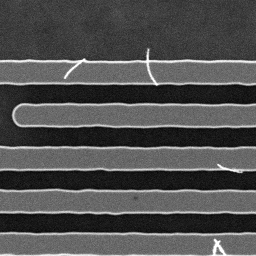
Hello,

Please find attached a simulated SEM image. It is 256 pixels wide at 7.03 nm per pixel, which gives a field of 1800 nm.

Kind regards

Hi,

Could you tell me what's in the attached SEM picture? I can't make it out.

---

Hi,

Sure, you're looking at groups of lines, slits or small figures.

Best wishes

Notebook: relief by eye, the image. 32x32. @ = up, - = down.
--------------------------------
--------------------------------
--------------------------------
--------------------------------
--------------------------------
--------------------------------
--------------------------------
--------------------------------
@@@@@@@@@@@@@@@@@@@@@@@@@@@@@@@@
@@@@@@@@@@@@@@@@@@@@@@@@@@@@@@@@
-@@@--------@@@@-@@@-@@---@@@-@@
--------------------------------
--------------------------------
--@@@@@@@@@@@@@@@@@@@@@@@@@@@@@@
--@@@@@@@@@@@@@@@@@@@@@@@@@@@@@@
--@@@@@@@@@@@@@@@@@@@@@@@@@@@@@@
--------------------------------
--------------------------------
@@@@@@@@@@@@@@@@@@@@@@@@@@@@@@@@
@@@@@@@@@@@@@@@@@@@@@@@@@@@@@@@@
@@@@@@@@@@@@@@@@@@@@@@@@@@@@@@@@
--------------------------------
--------------------------------
--------------------------------
@@@@@@@@@@@@@@@@@@@@@@@@@@@@@@@@
@@@@@@@@@@@@@@@@@@@@@@@@@@@@@@@@
@@@@@@@@@@@@@@@@@@@@@@@@@@@@@@@@
--------------------------------
--------------------------------
@@@@@@@@@@@@@@@@@@@@@@@@@@@@@@@@
@@@@@@@@@@@@@@@@@@@@@@@@@@@@@@@@
@@@@@@@@@@@@@@@@@@@@@@@@@@@@@@@@